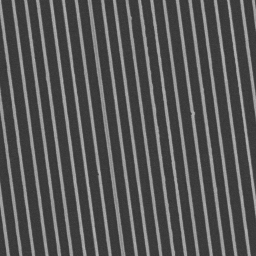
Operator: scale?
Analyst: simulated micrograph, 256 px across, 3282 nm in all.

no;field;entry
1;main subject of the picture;parallel lines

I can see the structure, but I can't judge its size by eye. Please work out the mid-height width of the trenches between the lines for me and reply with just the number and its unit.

9.91 pixels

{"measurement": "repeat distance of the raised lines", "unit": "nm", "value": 162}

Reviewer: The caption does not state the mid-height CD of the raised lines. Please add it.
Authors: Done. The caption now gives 34.9 nanometres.